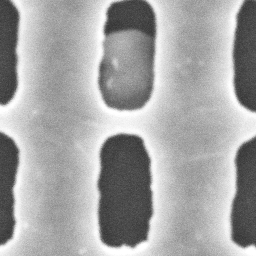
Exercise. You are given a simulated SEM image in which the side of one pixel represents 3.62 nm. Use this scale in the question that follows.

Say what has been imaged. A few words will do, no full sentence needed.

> holes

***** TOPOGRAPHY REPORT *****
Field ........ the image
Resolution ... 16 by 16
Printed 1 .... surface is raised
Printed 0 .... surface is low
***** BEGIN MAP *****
0111111000111110
0111111000111110
0111110000111110
0111110000111100
0111110000111110
0111110000111110
1111111001111110
1111111111111111
0111111001111111
0111110001111110
0111110001111110
0111110000111110
0111110000111110
0111110000111100
0111110001111100
1111111111111111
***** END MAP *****